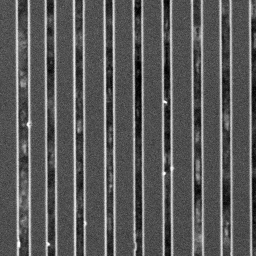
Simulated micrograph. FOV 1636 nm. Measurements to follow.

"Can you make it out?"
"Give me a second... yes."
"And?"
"parallel lines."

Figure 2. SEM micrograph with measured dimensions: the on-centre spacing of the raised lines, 185 nanometers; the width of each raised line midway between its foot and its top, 0.133 µm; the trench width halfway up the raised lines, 8.75 pixels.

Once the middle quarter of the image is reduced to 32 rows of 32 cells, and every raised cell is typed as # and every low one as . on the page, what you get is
###..#####...####..######..#####
###..#####...#####.######..#####
###..#####...#####..#####..#####
###..#####...#####..#####..#####
###..#####...#####..#####..#####
###..#####...#####..#####..#####
###..#####...#####..#####..#####
###..#####...#####..#####..#####
###..#####...#####..#####..#####
###..#####...#####..#####..#####
###..#####...#####..#####..#####
###..#####...#####..#####..#####
###..#####...#####..#####..#####
###..#####...#####..#####..#####
###..#####...#####..#####..#####
###..#####...#####..#####..#####
###..#####...#####..#####..#####
###..#####...#####..#####..#####
###..#####...#####..#####..#####
###..#####...#####..#####..#####
###..#####...#####..#####..#####
###..#####...#####..#####..#####
###..#####...#####..#####..#####
###..#####...#####..#####..#####
###..#####...#####..#####..#####
###..#####...#####..#####..#####
###..#####...#####..#####..#####
###..#####...#####..#####..#####
###..#####...#####..#####..#####
###..#####...#####..#####..#####
###..#####...#####..#####..#####
###..#####...#####..#####..#####